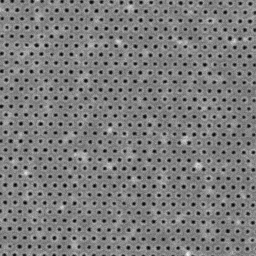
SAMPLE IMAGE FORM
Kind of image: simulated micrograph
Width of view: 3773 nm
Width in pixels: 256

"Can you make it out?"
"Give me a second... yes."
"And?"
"a regular array of holes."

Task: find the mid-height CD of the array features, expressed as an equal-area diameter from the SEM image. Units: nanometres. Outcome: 62.2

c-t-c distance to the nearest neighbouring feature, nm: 142